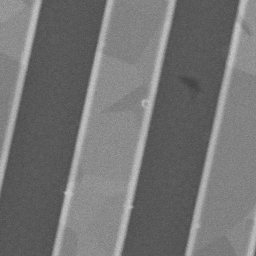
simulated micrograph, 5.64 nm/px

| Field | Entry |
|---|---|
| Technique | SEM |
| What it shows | one or a few lines or trenches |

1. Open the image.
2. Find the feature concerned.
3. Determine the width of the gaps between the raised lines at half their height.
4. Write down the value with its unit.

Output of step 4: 398 nanometres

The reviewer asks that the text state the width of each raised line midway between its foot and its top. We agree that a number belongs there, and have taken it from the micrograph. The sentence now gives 338 nm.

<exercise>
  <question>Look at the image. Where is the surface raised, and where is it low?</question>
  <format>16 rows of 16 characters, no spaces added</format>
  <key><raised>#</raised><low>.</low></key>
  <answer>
##.....####....#
##.....###.....#
##....####.....#
##....####.....#
#.....####....##
#.....####....##
#.....###.....##
#....####.....##
#....####....###
.....####....###
.....####....###
....####.....###
....####.....###
....####....####
....####....####
....###.....####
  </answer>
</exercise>